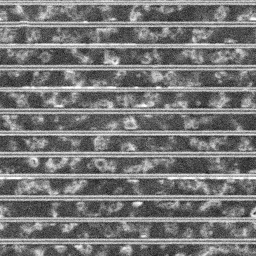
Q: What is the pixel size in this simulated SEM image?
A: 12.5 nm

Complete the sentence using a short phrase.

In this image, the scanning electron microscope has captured parallel lines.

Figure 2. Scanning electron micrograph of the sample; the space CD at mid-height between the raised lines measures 221 nm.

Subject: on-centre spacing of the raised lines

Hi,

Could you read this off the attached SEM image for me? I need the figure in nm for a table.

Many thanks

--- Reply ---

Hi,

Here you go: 271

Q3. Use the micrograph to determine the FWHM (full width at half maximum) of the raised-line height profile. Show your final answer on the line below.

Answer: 54.6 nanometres